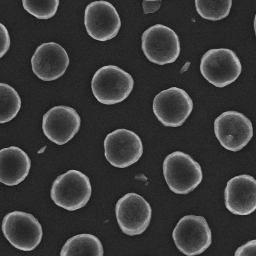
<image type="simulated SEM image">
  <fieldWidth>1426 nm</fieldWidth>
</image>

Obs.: a regular array of raised bodies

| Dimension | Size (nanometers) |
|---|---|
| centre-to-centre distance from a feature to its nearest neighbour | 354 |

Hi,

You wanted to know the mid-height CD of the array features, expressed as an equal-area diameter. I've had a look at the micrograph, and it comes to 206 nm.